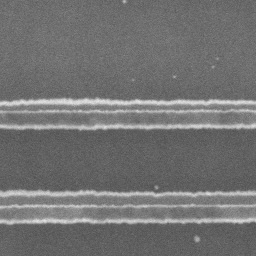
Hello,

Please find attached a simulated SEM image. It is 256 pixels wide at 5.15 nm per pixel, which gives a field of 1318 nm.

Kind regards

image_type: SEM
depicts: lines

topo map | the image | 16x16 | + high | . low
................
................
................
................
................
................
++++++++++++++++
++++++++++++++++
................
................
................
................
++++++++++++++++
++++++++++++++++
................
................